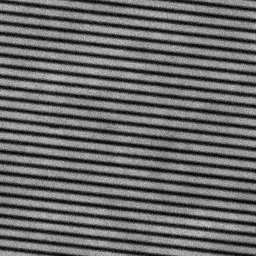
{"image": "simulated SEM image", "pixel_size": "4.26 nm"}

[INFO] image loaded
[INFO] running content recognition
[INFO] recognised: parallel lines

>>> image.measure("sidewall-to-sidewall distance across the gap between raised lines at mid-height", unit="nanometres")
18.5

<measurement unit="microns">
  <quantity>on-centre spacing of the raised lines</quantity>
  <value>0.0454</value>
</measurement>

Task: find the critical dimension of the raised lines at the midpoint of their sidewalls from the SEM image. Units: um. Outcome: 0.0254